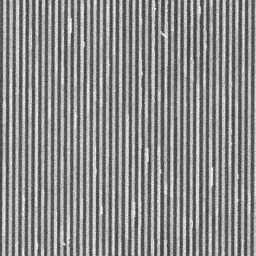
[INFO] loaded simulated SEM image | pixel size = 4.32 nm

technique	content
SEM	parallel lines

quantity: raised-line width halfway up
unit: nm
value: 13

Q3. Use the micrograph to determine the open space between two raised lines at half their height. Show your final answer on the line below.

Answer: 17.3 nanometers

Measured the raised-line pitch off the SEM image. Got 27.9 nm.